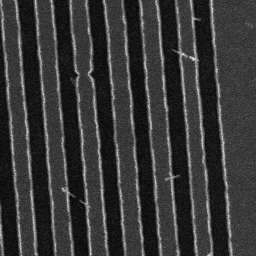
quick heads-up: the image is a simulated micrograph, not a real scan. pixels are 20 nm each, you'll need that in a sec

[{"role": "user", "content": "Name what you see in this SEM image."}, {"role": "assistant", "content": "parallel lines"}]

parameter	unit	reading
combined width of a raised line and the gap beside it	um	0.701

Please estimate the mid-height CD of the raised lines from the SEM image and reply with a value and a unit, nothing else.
357 nm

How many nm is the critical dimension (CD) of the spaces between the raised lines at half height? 337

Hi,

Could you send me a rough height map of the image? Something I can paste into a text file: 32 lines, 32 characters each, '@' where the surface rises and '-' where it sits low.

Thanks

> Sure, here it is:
@@--@@@--@@--@@--@@@--@@--@@@@@@
@@---@@--@@--@@---@@--@@--@@@@@@
@@---@@--@@--@@@--@@--@@--@@@@@@
@@---@@--@@--@@@--@@--@@---@@@@@
@@---@@--@@--@@@--@@--@@---@@@@@
@@@--@@--@@---@@--@@--@@---@@@@@
-@@--@@--@@@--@@--@@--@@@--@@@@@
-@@--@@--@@---@@--@@---@@--@@@@@
-@@--@@--@@---@@--@@---@@--@@@@@
-@@--@@---@---@@--@@@--@@--@@@@@
-@@--@@---@@--@@--@@@--@@--@@@@@
-@@--@@---@@--@@--@@@--@@--@@@@@
-@@--@@---@@--@@@-@@@--@@--@@@@@
-@@--@@@--@@--@@@--@@--@@--@@@@@
-@@--@@@--@@--@@@--@@--@@--@@@@@
-@@---@@--@@--@@@--@@--@@--@@@@@
-@@@--@@--@@--@@@--@@--@@---@@@@
-@@@--@@--@@--@@@--@@--@@---@@@@
-@@@--@@--@@---@@--@@--@@---@@@@
--@@--@@--@@@--@@--@@---@@--@@@@
--@@--@@--@@@--@@--@@---@@--@@@@
--@@--@@--@@@--@@--@@---@@--@@@@
--@@--@@--@@@--@@--@@@--@@--@@@@
--@@--@@---@@--@@--@@@--@@--@@@@
--@@--@@@--@@--@@--@@@--@@--@@@@
--@@--@@@--@@--@@--@@@--@@--@@@@
--@@---@@--@@--@@@--@@--@@--@@@@
--@@---@@--@@--@@@--@@--@@--@@@@
--@@---@@--@@--@@@--@@--@@---@@@
--@@---@@--@@--@@@--@@--@@---@@@
--@@---@@--@@--@@@--@@--@@---@@@
---@@--@@--@@---@@--@@--@@@--@@@